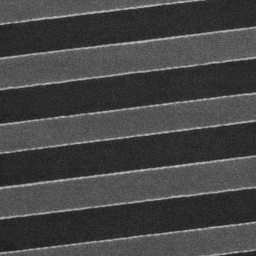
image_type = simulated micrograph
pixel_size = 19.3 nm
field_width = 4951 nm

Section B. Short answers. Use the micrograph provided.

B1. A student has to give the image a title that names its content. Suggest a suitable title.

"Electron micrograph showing lines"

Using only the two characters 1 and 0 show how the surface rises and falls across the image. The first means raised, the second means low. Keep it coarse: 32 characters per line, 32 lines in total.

11111111111111111111110000000000
11111111111110000000000000000000
11111000000000000000000000000000
00000000000000000000000000000001
00000000000000000000000111111111
00000000000000011111111111111111
00000011111111111111111111111111
11111111111111111111111111111100
11111111111111111111110000000000
11111111111111000000000000000000
11111000000000000000000000000000
00000000000000000000000000000000
00000000000000000000000011111111
00000000000000000111111111111111
00000000111111111111111111111111
11111111111111111111111111111100
11111111111111111111100000000000
11111111111111000000000000000000
11111100000000000000000000000000
00000000000000000000000000000000
00000000000000000000000011111111
00000000000000001111111111111111
00000000111111111111111111111111
11111111111111111111111111111110
11111111111111111111111100000000
11111111111111100000000000000000
11111110000000000000000000000000
00000000000000000000000000000000
00000000000000000000000000111111
00000000000000000111111111111111
00000000011111111111111111111111
01111111111111111111111111111100